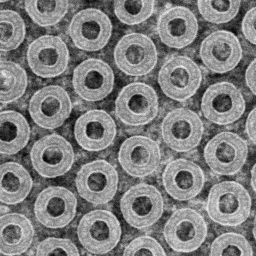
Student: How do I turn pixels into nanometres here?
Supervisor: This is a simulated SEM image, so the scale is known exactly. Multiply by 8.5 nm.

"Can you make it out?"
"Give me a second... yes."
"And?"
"a regular array of ring-shaped raised bodies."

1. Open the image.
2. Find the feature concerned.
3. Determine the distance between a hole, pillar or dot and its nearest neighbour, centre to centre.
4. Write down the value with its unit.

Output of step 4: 0.417 µm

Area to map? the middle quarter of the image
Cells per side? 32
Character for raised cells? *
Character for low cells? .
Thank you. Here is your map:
....*******...********...*******
...***..****...******...***....*
...***...***....****....***....*
..***.....**............**.....*
..***.....**............***....*
...**....***....*****...***....*
...***..****...*******...*******
*...*******...****.****...******
*....*****...***.....**....****.
*............***.....**.........
**...........***.....**.........
**...........****....**.....***.
*....******..*****.****...******
*...********..********...*******
...***...***...******....***...*
...**.....***............**.....
...**.....***............**.....
...**.....***............**.....
...***....**.....****....***...*
*...********...********..*******
**...******...****..***...******
**.....*......***....***....***.
**............***....***........
**............***....***........
**.....***....***....***...*****
**...*******...********...******
*...*********..*******...*******
....**....***....****....***....
...***.....**............***....
...***.....**............***....
...***.....**.....****...***....
*..***....***...*******...******